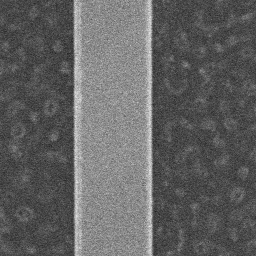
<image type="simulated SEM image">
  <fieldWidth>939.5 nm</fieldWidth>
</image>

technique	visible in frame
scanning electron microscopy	one or a few lines or trenches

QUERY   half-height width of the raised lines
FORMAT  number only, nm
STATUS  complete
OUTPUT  274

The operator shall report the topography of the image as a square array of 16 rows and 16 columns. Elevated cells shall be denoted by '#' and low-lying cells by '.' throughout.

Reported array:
.....####.......
.....####.......
.....####.......
.....####.......
.....####.......
.....####.......
.....####.......
.....####.......
.....####.......
.....####.......
.....####.......
.....####.......
.....####.......
.....####.......
.....####.......
.....####.......